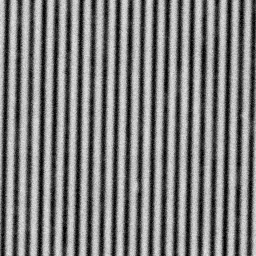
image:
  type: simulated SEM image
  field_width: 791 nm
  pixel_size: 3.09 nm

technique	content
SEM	parallel lines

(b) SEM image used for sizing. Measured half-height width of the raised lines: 21.2 nanometres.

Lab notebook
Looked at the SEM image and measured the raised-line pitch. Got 38.1 nanometres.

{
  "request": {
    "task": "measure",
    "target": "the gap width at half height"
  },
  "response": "15.1 nm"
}